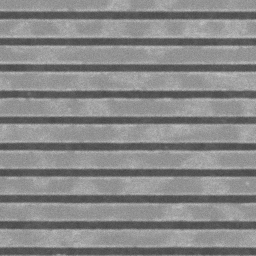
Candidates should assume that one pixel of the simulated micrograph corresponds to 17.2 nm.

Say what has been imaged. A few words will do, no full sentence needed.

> parallel lines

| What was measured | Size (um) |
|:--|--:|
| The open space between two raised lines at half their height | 0.146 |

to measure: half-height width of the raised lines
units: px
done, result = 17.7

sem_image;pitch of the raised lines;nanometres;450